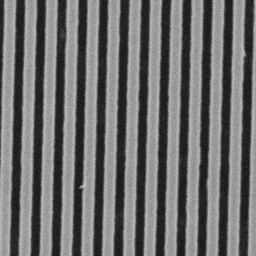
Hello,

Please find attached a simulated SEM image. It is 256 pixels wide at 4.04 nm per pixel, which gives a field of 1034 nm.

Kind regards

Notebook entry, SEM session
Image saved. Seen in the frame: parallel lines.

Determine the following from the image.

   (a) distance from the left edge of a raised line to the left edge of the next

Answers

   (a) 0.0841 um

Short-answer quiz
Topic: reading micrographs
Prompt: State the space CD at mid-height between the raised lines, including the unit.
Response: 41.4 nm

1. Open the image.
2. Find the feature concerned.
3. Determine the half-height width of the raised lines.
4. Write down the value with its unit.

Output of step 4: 11.1 pixels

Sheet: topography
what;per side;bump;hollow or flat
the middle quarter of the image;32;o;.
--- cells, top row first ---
ooo...oo...oo...ooo..ooo...oo...
ooo...oo...oo...ooo..ooo...oo...
ooo...oo...oo...ooo..ooo...oo...
ooo...oo...ooo..ooo..ooo...oo...
.oo...oo...oo...ooo..ooo..ooo...
ooo...oo...oo...ooo..ooo..ooo...
ooo...oo...oo...ooo..ooo..ooo...
ooo...oo...oo...oo...ooo..ooo...
ooo...oo...oo...oo...ooo..ooo...
ooo...oo...oo...ooo..ooo..ooo...
ooo..ooo...oo...oo...ooo..ooo...
ooo..ooo...oo...oo...ooo..ooo..o
ooo..ooo...oo...oo...ooo..ooo..o
ooo..ooo...oo...oo...ooo..ooo..o
ooo..ooo...oo...oo...ooo..ooo..o
ooo..ooo...oo...oo...oo...ooo..o
ooo..ooo...oo...oo...oo...ooo..o
ooo..ooo..ooo...oo...oo...ooo..o
ooo..ooo..ooo...oo...oo...ooo..o
ooo..ooo..ooo...oo...oo...ooo..o
oo...ooo..ooo...oo...oo...oo...o
oo...ooo...oo..ooo...oo...oo...o
oo...ooo..ooo...oo...oo...oo...o
ooo..ooo..ooo...oo...oo...oo...o
ooo..ooo..ooo...oo...oo...oo...o
oo...ooo..ooo..ooo...oo...oo...o
ooo..ooo..ooo...oo...oo...oo...o
oo...ooo..ooo..ooo...oo...oo...o
oo...ooo..ooo..ooo...oo...oo...o
oo...ooo..ooo..ooo...oo...oo...o
oo...ooo..ooo..ooo...oo...oo...o
oo...ooo..ooo..ooo...oo...oo...o